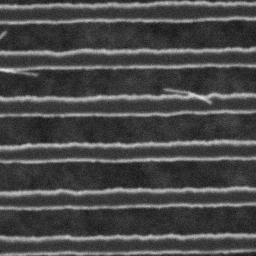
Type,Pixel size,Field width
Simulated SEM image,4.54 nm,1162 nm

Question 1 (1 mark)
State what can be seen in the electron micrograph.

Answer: lines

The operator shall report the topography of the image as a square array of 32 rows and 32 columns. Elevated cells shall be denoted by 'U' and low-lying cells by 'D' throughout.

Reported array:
DDDDDDDDDDDDDDDDDDDUUUUUUUUUUUUU
UUUUUUUUUUUUUUUUUUUUUUUUUUUUUUUU
UUUUUUUUUUUUUUUUUUUUUUUUUUDDDDDD
DDDDDDDDDDDDDDDDDDDDDDDDDDDDDDDD
DDDDDDDDDDDDDDDDDDDDDDDDDDDDDDDD
DDDDDDDDDDDDDDDDDDDDDDDDDDDDDDDD
DDDDDDDDDUUUUUUUUUUUUUUUUUUUUUUU
UUUUUUUUUUUUUUUUUUUUUUUUUUUUUUUU
UUUUUUUUUUDDDDUDDDDDDDDDDDDDDDDD
DDDDDDDDDDDDDDDDDDDDDDDDDDDDDDDD
DDDDDDDDDDDDDDDDDDDDDDDDDDDDDDDD
DDDDDDDDDDDDDDDDDDDDDDDDDDDDDDDD
UUUUUUUUUUUUUUUUUUUUUUUUUUUUUUUU
UUUUUUUUUUUUUUUUUUUUUUUUUUUUUUUU
DDDDDUDDDDDDDDDDDDDDDDDDDDDDDDDD
DDDDDDDDDDDDDDDDDDDDDDDDDDDDDDDD
DDDDDDDDDDDDDDDDDDDDDDDDDDDDDDDD
DDDDDDDDDDDDDDDDDDDDDDDDDDDDDDDD
UUUUUUUUUUUUUUUUUUUUUUUUUUUUUUUU
UUUUUUUUUUUUUUUUUUUUUUUUUUUUUUUU
DDDDDDDDDDDDDDDDDDDDDDDDDDDDDDDD
DDDDDDDDDDDDDDDDDDDDDDDDDDDDDDDD
DDDDDDDDDDDDDDDDDDDDDDDDDDDDDDDD
DDDDDDDDDDDDDDDDDDDDDDDDDDDDDUUD
UUUUUUUUUUUUUUUUUUUUUUUUUUUUUUUU
UUUUUUUUUUUUUUUUUUUUUUUUUUUUUUUU
DDDDDDDDDDDDDDDDDDDDDDDDDDDDDDDD
DDDDDDDDDDDDDDDDDDDDDDDDDDDDDDDD
DDDDDDDDDDDDDDDDDDDDDDDDDDDDDDDD
DDDDDDDDDDDDDDDDDDDDDUDDDUUUUUUU
UUUUUUUUUUUUUUUUUUUUUUUUUUUUUUUU
UUUUUUUUUUUUUUUUUUUUUUUUUUUUUDDD